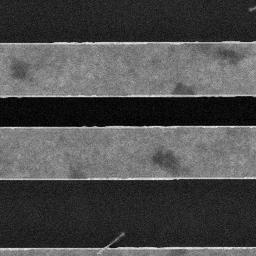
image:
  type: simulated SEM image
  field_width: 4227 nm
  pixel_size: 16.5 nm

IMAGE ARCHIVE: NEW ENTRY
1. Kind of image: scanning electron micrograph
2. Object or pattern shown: lines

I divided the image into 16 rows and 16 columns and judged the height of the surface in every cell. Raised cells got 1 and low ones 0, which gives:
0000000000000000
0000000000000000
0000000000000000
1111111111111111
1111111111111111
1111111111111111
0000000000000000
0000000000000000
1111111111111111
1111111111111111
1111111111111111
0000000000000000
0000000000000000
0000000000000000
0000000000000000
0000001111111111